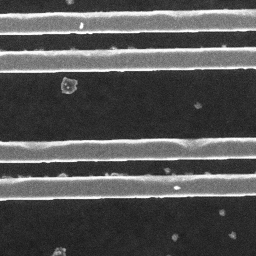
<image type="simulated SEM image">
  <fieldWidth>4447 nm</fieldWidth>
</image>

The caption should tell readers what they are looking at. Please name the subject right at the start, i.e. lines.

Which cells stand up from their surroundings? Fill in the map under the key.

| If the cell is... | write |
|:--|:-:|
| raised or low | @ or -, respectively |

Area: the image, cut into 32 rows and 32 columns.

--------------------------------
-------------------@@----@@@@@@-
@@@@@@@@@@@@@@@@@@@@@@@@@@@@@@@@
@@@@@@@@@@@@@@@@@@@@@@@@@@@@@@@@
--------------------------------
--------------------------------
--------------@@@@@@@@@@@@@@@@@@
@@@@@@@@@@@@@@@@@@@@@@@@@@@@@@@@
@@@@@@@@@@@@@@@@@@@@@@@@@@@@@@--
--------------------------------
--------@-----------------------
--------------------------------
--------------------------------
--------------------------------
--------------------------------
--------------------------------
--------------------------------
------------------@@@@----@@@@@@
@@@@@@@@@@@@@@@@@@@@@@@@@@@@@@@@
@@@@@@@@@@@@@@@@@@@@@@@@@@@@@@@@
--------------------------------
--------------------------------
--@@@@@@@@@@@@@@@@@@@@@@@@@@@@@@
@@@@@@@@@@@@@@@@@@@@@@@@@@@@@@@@
@@@@@@@@@@@@@@@@@@@@@@----------
--------------------------------
--------------------------------
--------------------------------
--------------------------------
--------------------------------
--------------------------------
--------------------------------